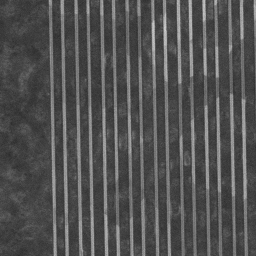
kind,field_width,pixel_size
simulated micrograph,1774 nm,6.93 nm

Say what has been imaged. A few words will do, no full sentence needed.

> parallel lines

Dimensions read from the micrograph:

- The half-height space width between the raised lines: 0.0701 um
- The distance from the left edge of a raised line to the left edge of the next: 88.2 nanometers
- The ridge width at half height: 0.0139 micrometres